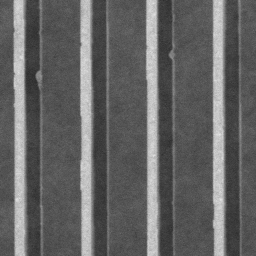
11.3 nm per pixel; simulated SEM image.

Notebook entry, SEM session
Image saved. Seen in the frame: lines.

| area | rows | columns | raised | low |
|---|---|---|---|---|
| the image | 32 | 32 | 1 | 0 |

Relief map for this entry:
11100111111001111111001111110011
11100111111001111111001111110011
11100111111001111111001111110011
11100111111001111111001111110011
11100111111000111111001111110011
11100111111000111111001111110011
11100111111000111111011111110011
11100111111000111111001111110011
11100111111000111111001111110011
11100111111000111111001111110011
11100111111000111111001111110011
11100111111000111111001111110011
11100111111000111111001111110011
11100111111000111111001111110011
11100111111000111111001111110011
11100111111000111111001111110011
11100111111000111111001111110011
11100111111000111111001111110011
11100111111000111111001111110011
11100111111000111111001111110011
11100111111000111111001111110011
11100111111000111111001111110011
11100111111000111111001111110011
11100111111000111111001111110011
11100111111000111111001111110011
11100111111000111111001111110011
11100111111000111111001111110011
11100111111000111111001111110011
11100111111000111111001111110011
11100111111000111111001111110011
11100111111000111111001111110011
11100111111000111111001111110011